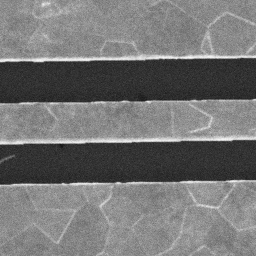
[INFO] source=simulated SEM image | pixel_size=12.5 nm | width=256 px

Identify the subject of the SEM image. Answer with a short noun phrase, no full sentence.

lines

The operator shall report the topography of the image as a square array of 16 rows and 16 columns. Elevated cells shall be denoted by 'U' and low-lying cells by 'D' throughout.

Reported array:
UUUUUUUUUUUUUUUU
UUUUUUUUUUUUUUUU
UUUUUUUUUUUUUUUU
UUUUUUUUUUUUUUUU
DDDDDDDDDDDDDDDD
DDDDDDDDDDDDDDDD
DUUUUUUUUUUUUUUU
UUUUUUUUUUUUUUUU
UUUUUUUUUUUUUUUU
DDDDDDDDDDDDDDDD
DDDDDDDDDDDDDDDD
DDDDUUUUUUUUUUUU
UUUUUUUUUUUUUUUU
UUUUUUUUUUUUUUUU
UUUUUUUUUUUUUUUU
UUUUUUUUUUUUUUUU